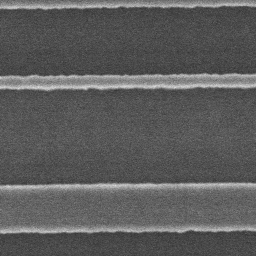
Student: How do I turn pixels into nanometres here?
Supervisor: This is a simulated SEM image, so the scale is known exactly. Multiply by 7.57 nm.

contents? lines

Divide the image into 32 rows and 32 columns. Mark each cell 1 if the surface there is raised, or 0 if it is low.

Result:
11111111111111111111111111111111
00000000000000000000000000000000
00000000000000000000000000000000
00000000000000000000000000000000
00000000000000000000000000000000
00000000000000000000000000000000
00000000000000000000000000000000
00000000000000000000000000000000
00000000000000000000000000000000
00001001111111111111111111111111
11111111111111111111111111111111
00000000000000000000000000000000
00000000000000000000000000000000
00000000000000000000000000000000
00000000000000000000000000000000
00000000000000000000000000000000
00000000000000000000000000000000
00000000000000000000000000000000
00000000000000000000000000000000
00000000000000000000000000000000
00000000000000000000000000000000
00000000000000000000000000000000
00000000000000000000000000000000
11111111111111111111111111111111
11111111111111111111111111111111
11111111111111111111111111111111
11111111111111111111111111111111
11111111111111111111111111111111
11111111111111111111111111111111
00000000000000000000000000000000
00000000000000000000000000000000
00000000000000000000000000000000